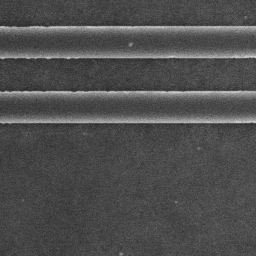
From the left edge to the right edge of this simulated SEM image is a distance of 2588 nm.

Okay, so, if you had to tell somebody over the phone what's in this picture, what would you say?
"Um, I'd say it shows lines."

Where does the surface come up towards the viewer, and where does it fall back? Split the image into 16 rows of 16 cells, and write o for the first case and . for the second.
................
................
oooooooooooooooo
oooooooooooooooo
................
................
oooooooooooooooo
oooooooooooooooo
................
................
................
................
................
................
................
................